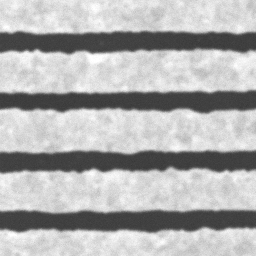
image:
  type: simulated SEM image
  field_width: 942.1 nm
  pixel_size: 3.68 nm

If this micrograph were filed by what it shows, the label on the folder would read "lines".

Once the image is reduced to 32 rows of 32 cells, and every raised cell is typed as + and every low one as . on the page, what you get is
++++++++++++++++++++++++++++++++
++++++++++++++++++++++++++++++++
++++++++++++++++++++++++++++++++
++++++++++++++++++++++++++++++++
................................
................................
.+.++.....+....+.+++++++++++++.+
++++++++++++++++++++++++++++++++
++++++++++++++++++++++++++++++++
++++++++++++++++++++++++++++++++
++++++++++++++++++++++++++++++++
++++++++++++++++..+.+.....+.....
................................
................................
++++++++++++++++++++++++++++++++
++++++++++++++++++++++++++++++++
++++++++++++++++++++++++++++++++
++++++++++++++++++++++++++++++++
++++++++++++++++++++++++++++++++
................................
................................
...+++++..+++++++++++++++++.++++
++++++++++++++++++++++++++++++++
++++++++++++++++++++++++++++++++
++++++++++++++++++++++++++++++++
++++++++++++++++++++++++++++++++
......+++...++..................
................................
.........................+......
++++++++++++++++++++++++++++++++
++++++++++++++++++++++++++++++++
++++++++++++++++++++++++++++++++